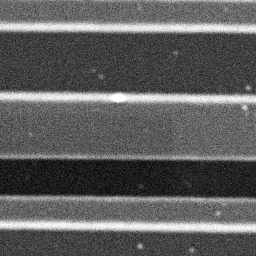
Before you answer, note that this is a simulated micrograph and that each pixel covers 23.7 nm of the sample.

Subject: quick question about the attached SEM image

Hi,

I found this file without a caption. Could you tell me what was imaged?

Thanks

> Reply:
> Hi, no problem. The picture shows lines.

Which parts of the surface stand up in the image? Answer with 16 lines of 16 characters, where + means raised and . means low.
++++++++++++++++
++++++++++++++++
................
................
................
................
++++++++++++++++
++++++++++++++++
++++++++++++++++
++++++++++++++++
................
................
++++++++++++++++
++++++++++++++++
................
................